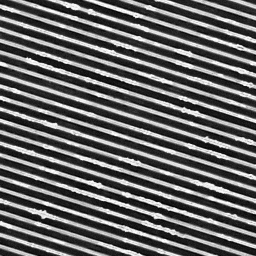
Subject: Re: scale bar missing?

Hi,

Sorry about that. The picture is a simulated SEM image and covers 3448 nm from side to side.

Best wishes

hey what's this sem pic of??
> parallel lines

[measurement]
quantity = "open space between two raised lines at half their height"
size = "0.098 micrometres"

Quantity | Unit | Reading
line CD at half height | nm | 45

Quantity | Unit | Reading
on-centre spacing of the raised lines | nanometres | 147